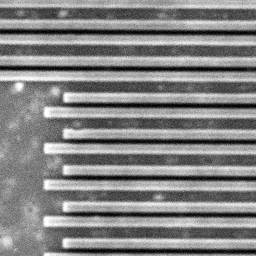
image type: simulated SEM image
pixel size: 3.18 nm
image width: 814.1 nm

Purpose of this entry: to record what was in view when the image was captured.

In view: parallel lines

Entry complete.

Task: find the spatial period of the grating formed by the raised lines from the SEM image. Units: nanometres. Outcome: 57.5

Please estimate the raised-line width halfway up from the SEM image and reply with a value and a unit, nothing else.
26.3 nm